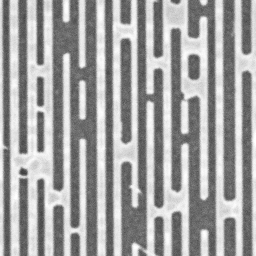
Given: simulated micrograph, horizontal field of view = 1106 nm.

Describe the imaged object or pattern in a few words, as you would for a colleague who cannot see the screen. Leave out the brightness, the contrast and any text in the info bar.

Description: parallel lines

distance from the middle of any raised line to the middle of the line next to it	74.5	nm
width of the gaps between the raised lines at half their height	43.8	nm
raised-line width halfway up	29.2	nm